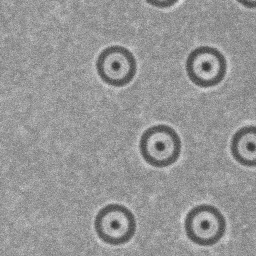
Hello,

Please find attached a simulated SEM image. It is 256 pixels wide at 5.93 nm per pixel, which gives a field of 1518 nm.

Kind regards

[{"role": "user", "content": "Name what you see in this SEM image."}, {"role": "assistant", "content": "ring-shaped grooves with a dot in the middle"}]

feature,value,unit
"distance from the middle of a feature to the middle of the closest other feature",0.534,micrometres